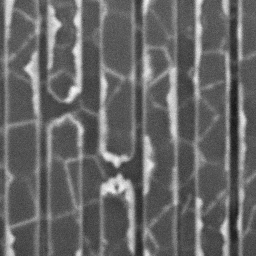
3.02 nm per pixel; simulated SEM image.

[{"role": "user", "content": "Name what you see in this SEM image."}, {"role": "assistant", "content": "parallel lines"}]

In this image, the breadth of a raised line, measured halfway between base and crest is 101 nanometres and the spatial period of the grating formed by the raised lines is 143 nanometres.